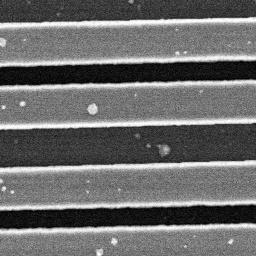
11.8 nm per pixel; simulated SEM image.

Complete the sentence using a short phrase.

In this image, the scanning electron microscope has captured lines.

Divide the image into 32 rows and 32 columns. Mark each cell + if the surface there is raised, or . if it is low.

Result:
................................
................................
.......................+++++++++
++++++++++++++++++++++++++++++++
++++++++++++++++++++++++++++++++
++++++++++++++++++++++++++++++++
++++++++++++++++++++++++++++++++
++++++++++++++++++++++++++++....
................................
................................
.........+++++++++++++++++++++++
++++++++++++++++++++++++++++++++
++++++++++++++++++++++++++++++++
++++++++++++++++++++++++++++++++
++++++++++++++++++++++++++++++++
+++++++++++++++++++++++++.......
................................
................................
................................
................................
....................++++++++++++
++++++++++++++++++++++++++++++++
++++++++++++++++++++++++++++++++
++++++++++++++++++++++++++++++++
++++++++++++++++++++++++++++++++
++++++++++++++++++++++++++++++..
................................
................................
.........+++++++++++++++++++++++
++++++++++++++++++++++++++++++++
++++++++++++++++++++++++++++++++
++++++++++++++++++++++++++++++++